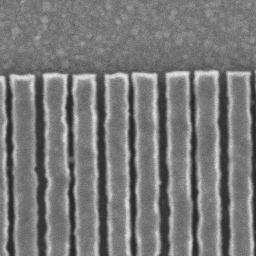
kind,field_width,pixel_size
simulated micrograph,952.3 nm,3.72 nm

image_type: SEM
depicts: parallel lines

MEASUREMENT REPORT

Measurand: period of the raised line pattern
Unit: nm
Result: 115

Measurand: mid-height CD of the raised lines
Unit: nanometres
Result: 84.6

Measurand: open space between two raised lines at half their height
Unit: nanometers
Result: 31.1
